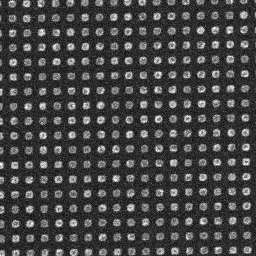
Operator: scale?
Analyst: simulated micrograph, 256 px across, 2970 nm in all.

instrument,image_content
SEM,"a regular array of raised bodies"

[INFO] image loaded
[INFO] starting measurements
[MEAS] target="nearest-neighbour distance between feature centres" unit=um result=0.166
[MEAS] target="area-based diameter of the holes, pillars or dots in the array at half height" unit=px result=7.31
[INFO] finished